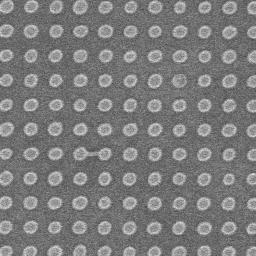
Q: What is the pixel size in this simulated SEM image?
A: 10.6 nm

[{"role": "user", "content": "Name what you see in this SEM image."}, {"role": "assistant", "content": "a regular array of raised bodies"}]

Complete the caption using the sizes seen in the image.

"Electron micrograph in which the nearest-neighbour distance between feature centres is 259 nm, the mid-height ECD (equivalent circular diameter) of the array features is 135 nm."